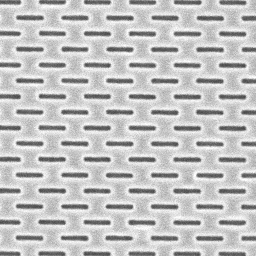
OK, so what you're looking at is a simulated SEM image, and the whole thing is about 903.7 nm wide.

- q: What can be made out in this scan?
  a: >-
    a regular array of holes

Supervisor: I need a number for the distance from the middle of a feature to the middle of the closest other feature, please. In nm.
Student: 95.6